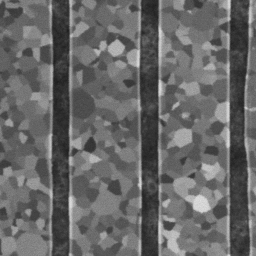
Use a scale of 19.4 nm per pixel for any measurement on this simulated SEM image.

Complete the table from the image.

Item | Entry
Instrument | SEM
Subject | one or a few lines or trenches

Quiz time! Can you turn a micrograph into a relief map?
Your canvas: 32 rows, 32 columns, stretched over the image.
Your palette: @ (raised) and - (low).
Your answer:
@@@@@@---@@@@@@@@---@@@@@@@@@--@
@@@@@@---@@@@@@@@---@@@@@@@@@--@
@@@@@@---@@@@@@@@---@@@@@@@@@--@
@@@@@@---@@@@@@@@---@@@@@@@@@--@
@@@@@@---@@@@@@@@@--@@@@@@@@@--@
@@@@@@---@@@@@@@@---@@@@@@@@@--@
@@@@@@---@@@@@@@@---@@@@@@@@@--@
@@@@@@---@@@@@@@@---@@@@@@@@@--@
@@@@@@---@@@@@@@@---@@@@@@@@@--@
@@@@@@---@@@@@@@@---@@@@@@@@@--@
@@@@@@---@@@@@@@@---@@@@@@@@@--@
@@@@@@---@@@@@@@@---@@@@@@@@@--@
@@@@@@---@@@@@@@@---@@@@@@@@@--@
@@@@@@---@@@@@@@@---@@@@@@@@@--@
@@@@@@---@@@@@@@@---@@@@@@@@@--@
@@@@@@---@@@@@@@@---@@@@@@@@@--@
@@@@@@---@@@@@@@@---@@@@@@@@@--@
@@@@@@---@@@@@@@@---@@@@@@@@@--@
@@@@@@---@@@@@@@@@--@@@@@@@@@--@
@@@@@@---@@@@@@@@---@@@@@@@@@--@
@@@@@@---@@@@@@@@@--@@@@@@@@@--@
@@@@@@---@@@@@@@@@--@@@@@@@@@--@
@@@@@@---@@@@@@@@@--@@@@@@@@@--@
@@@@@@---@@@@@@@@@--@@@@@@@@@--@
@@@@@@---@@@@@@@@@--@@@@@@@@@--@
@@@@@@---@@@@@@@@@--@@@@@@@@@--@
@@@@@@---@@@@@@@@@--@@@@@@@@@--@
@@@@@@---@@@@@@@@@--@@@@@@@@@--@
@@@@@@---@@@@@@@@@--@@@@@@@@@--@
@@@@@@---@@@@@@@@@--@@@@@@@@@--@
@@@@@@---@@@@@@@@---@@@@@@@@@--@
@@@@@@---@@@@@@@@---@@@@@@@@@--@